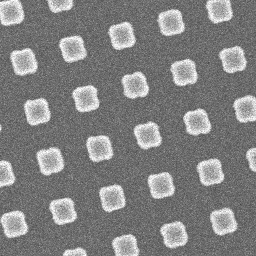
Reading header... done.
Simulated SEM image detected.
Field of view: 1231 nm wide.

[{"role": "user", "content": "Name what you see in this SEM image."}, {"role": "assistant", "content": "a regular array of raised bodies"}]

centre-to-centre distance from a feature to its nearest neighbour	50.7	px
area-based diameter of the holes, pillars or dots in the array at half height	122	nm